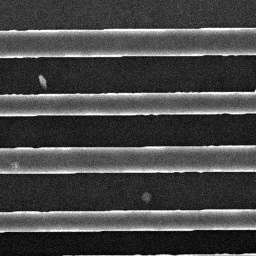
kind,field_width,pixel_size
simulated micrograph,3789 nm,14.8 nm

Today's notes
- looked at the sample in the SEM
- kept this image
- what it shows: lines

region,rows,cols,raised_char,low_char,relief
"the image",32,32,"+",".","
................................
................................
................................
................................
++++++++++++++++++++++++++++++++
++++++++++++++++++++++++++++++++
++++++++++++++++++++++++++++++++
................................
................................
................................
................................
...............................+
++++++++++++++++++++++++++++++++
++++++++++++++++++++++++++++++++
................................
................................
................................
................................
..................++++++++++++++
++++++++++++++++++++++++++++++++
++++++++++++++++++++++++++++++++
++++++++++......................
................................
................................
................................
................................
.............+++++++++++++++++++
++++++++++++++++++++++++++++++++
++++++++++++++++++++++++++++++++
................................
................................
................................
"